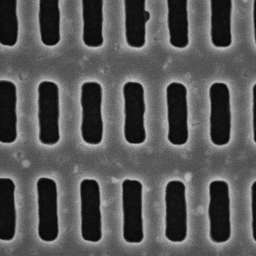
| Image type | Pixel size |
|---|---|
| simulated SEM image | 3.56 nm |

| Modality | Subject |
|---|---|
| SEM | a regular array of holes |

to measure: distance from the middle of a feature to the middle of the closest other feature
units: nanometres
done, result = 152